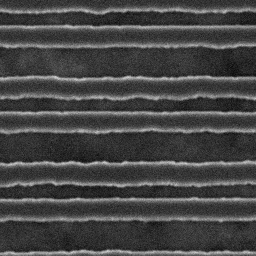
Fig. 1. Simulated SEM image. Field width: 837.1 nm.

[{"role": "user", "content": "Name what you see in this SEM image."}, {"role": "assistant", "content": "lines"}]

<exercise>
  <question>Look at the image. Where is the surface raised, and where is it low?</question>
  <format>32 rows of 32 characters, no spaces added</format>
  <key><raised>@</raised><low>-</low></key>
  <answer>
@@@@@@@@@@@@@@@@@@@@@@@@@@@@@@@@
-@@@@@-----@@@-------------@----
--------------------------------
@@@@@@@@@@@@@@@@@@@@@@@@@@@@@@@@
@@@@@@@@@@@@@@@@@@@@@@@@@@@@@@@@
@@@@@@@@@@@@@@@@@@@@@@@@@@@@@@@@
--------------------------------
--------------------------------
--------------------------------
--------------------------------
@@@@@@@@@@@@@@@@@@@@@@@@@@@@@@@@
@@@@@@@@@@@@@@@@@@@@@@@@@@@@@@@@
--------------------------------
--------------------------------
@@@@@@@@@@@@@@@@@@@@@@@@@@@@@@@@
@@@@@@@@@@@@@@@@@@@@@@@@@@@@@@@@
@@------@--@@@---------@---@----
--------------------------------
--------------------------------
--------------------------------
@@@@@@@@@@@@@@@@@@@@@@@@@@@@@@@@
@@@@@@@@@@@@@@@@@@@@@@@@@@@@@@@@
@@@@@@@@@@@@@@@@@@@@@@@@@@@@@@@@
--------------------------------
--------------------------------
@@@@@@@@@@@@@@@@@@@@@@@@@@@@@@@@
@@@@@@@@@@@@@@@@@@@@@@@@@@@@@@@@
@-@@@@@@@@@--@-@@@@@@@--@@@@@@@@
--------------------------------
--------------------------------
--------------------------------
---------@@@@@@@@--@@-@-----@-@-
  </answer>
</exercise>